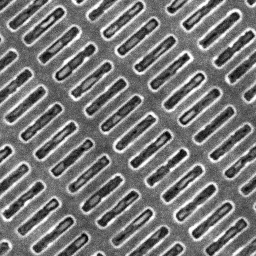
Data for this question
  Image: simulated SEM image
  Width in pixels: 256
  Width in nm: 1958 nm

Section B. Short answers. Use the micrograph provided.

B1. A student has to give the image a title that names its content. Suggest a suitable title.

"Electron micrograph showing a regular array of holes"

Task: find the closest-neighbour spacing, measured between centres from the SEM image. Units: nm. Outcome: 176